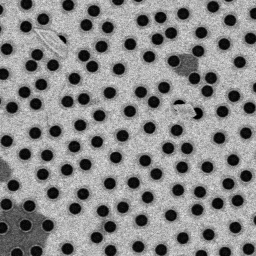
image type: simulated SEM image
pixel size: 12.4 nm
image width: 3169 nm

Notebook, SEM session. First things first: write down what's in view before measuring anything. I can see a regular array of holes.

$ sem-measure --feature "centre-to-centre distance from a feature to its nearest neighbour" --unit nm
243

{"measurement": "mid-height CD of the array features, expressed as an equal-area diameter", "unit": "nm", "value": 144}